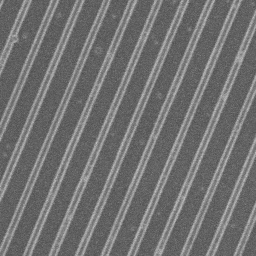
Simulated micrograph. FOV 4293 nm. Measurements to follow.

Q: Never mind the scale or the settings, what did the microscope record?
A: parallel lines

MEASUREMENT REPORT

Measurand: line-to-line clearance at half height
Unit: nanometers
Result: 310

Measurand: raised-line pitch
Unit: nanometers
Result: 406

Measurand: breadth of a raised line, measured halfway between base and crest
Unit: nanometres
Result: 98.7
